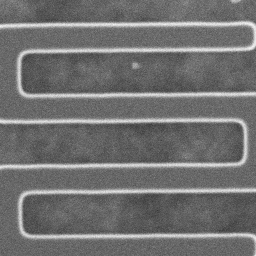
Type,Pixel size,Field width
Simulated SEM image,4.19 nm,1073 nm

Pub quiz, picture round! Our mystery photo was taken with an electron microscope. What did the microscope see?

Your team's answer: groups of lines, slits or small figures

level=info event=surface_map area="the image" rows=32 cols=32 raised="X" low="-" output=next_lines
--------------------------------
--------------------------------
--------------------------------
XXXXXXXXXXXXXXXXXXXXXXXXXXXXXXXX
XXXXXXXXXXXXXXXXXXXXXXXXXXXXXXXX
XXXXXXXXXXXXXXXXXXXXXXXXXXXXXXXX
XXXX----------------------------
XXX-----------------------------
XX------------------------------
XX------------------------------
XX------------------------------
XXX-----------------------------
XXXXXXXXXXXXXXXXXXXXXXXXXXXXXXXX
XXXXXXXXXXXXXXXXXXXXXXXXXXXXXXXX
XXXXXXXXXXXXXXXXXXXXXXXXXXXXXXXX
------------------------------XX
-------------------------------X
-------------------------------X
-------------------------------X
-------------------------------X
-----------------------------XXX
XXXXXXXXXXXXXXXXXXXXXXXXXXXXXXXX
XXXXXXXXXXXXXXXXXXXXXXXXXXXXXXXX
XXXXXXXXXXXXXXXXXXXXXXXXXXXXXXXX
XXX-----------------------------
XXX-----------------------------
XXX-----------------------------
XXX-----------------------------
XXX-----------------------------
XXXX-------XXXXXXXXXXXXXXXXXXXXX
XXXXXXXXXXXXXXXXXXXXXXXXXXXXXXXX
XXXXXXXXXXXXXXXXXXXXXXXXXXXXXXXX